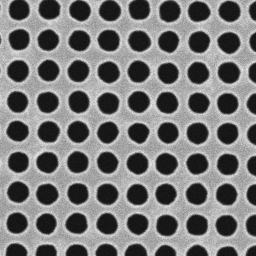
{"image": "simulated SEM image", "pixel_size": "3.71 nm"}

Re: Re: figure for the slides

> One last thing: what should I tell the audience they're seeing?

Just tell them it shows a regular array of holes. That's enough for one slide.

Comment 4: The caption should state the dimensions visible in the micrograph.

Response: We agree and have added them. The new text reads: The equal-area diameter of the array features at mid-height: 21.5 px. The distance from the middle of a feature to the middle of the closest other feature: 110 nanometers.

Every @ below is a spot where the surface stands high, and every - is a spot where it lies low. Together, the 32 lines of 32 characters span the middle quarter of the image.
@-----@@@----@@@-----@@@----@@@-
@-----@@@-----@@-----@@-----@@@-
@-----@@------@@-----@@------@@-
@@---@@@@-----@@-----@@@----@@@-
@@@-@@@@@@--@@@@@@-@@@@@----@@@@
@@@@@@@@@@@@@@@@@@@@@@@@@@@@@@@@
@@@@@@@@@@@@@@@@@@@@@@@@@@@@@@@@
@@---@@@@@--@@@@@----@@@---@@@@@
@-----@@@----@@@-----@@-----@@@-
@-----@@------@@-----@@------@@-
@-----@@@-----@@-----@@-----@@@-
@@----@@@----@@@@---@@@@----@@@@
@@@@@@@@@@@-@@@@@@@@@@@@@@@@@@@@
@@@@@@@@@@@@@@@@@@@@@@@@@@@@@@@@
@@--@@@@@@@-@@@@@@@@@@@@@--@@@@@
@-----@@@----@@@-----@@@----@@@-
@-----@@------@@-----@@@-----@@-
@-----@@------@@-----@@@-----@@-
@-----@@@----@@@@----@@@-----@@-
@@@-@@@@@---@@@@@@--@@@@@--@@@@@
@@@@@@@@@@@@@@@@@@@@@@@@@@@@@@@@
@@@@@@@@@@@@@@@@@@@@@@@@@@@@@@@@
@@---@@@@---@@@@@---@@@@--@@@@@@
@-----@@-----@@@-----@@-----@@@-
@-----@@------@@-----@@-----@@@-
@-----@@-----@@@-----@@-----@@@-
@@---@@@@----@@@-----@@-----@@@-
@@@@@@@@@@@@@@@@@@-@@@@@---@@@@@
@@@@@@@@@@@@@@@@@@@@@@@@@@@@@@@@
@@@@@@@@@@@@@@@@@@@@@@@@@@@@@@@@
@----@@@@---@@@@@---@@@@---@@@@@
@-----@@-----@@@-----@@-----@@@-